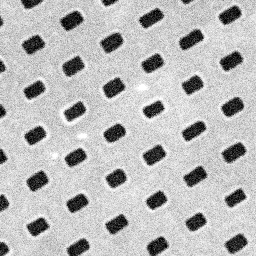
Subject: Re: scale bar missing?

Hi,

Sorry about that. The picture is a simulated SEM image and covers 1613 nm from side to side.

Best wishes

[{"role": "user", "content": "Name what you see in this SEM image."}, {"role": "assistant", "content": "a regular array of holes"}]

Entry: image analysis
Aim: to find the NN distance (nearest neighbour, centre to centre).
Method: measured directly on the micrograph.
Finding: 285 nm